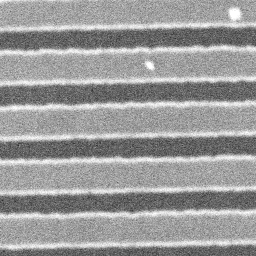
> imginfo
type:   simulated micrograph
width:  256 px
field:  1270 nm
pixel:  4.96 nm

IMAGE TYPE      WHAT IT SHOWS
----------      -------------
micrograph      lines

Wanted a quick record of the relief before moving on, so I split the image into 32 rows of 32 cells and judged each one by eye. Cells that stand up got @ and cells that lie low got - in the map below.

@@@@@@@@@@@@@@@@@@@@@@@@@@@@@@@@
@@@@@@@@@@@@@@@@@@@@@@@@@@@@@@@@
@@@@@@@@@@@@@@@@@@@@@@@@@@@@@@@@
@@@@@@@@@@@@@@@@@@--------------
--------------------------------
--------------------------------
@@@--@@@@@@@@@@@@@@@@@@@@@@@@@@@
@@@@@@@@@@@@@@@@@@@@@@@@@@@@@@@@
@@@@@@@@@@@@@@@@@@@@@@@@@@@@@@@@
@@@@@@@@@@@@@@@@@@@@@@@@@@@@@@@@
@@-@----------------------------
--------------------------------
--------------------------------
@@@@@@@@@@@@@@@@@@@@@@@@@@@@@@@@
@@@@@@@@@@@@@@@@@@@@@@@@@@@@@@@@
@@@@@@@@@@@@@@@@@@@@@@@@@@@@@@@@
@@@@@@@@@@@@@@@@@@@@@@@@@@@@@@@@
--------------------------------
--------------------------------
--------------------------------
@@@@@@@@@@@@@@@@@@@@@@@@@@@@@@@@
@@@@@@@@@@@@@@@@@@@@@@@@@@@@@@@@
@@@@@@@@@@@@@@@@@@@@@@@@@@@@@@@@
@@@@@@@@@@@@@@@@@@@@@@@@@@@@@@@@
--------------------------------
--------------------------------
-----------------------@@@@@@@@@
@@@@@@@@@@@@@@@@@@@@@@@@@@@@@@@@
@@@@@@@@@@@@@@@@@@@@@@@@@@@@@@@@
@@@@@@@@@@@@@@@@@@@@@@@@@@@@@@@@
@@@@@@@@@@@@@@@@@@@@@@@@@@@@@---
--------------------------------